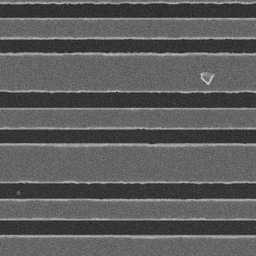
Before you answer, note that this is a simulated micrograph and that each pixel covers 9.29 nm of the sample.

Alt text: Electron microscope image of lines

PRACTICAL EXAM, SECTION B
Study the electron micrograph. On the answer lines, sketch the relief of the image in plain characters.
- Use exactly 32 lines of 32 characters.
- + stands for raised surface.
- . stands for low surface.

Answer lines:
................................
................................
++++++++++++++++++++++++++++++++
++++++++++++++++++++++++++++++++
++++++++++++++++++++++++++++++++
................................
................................
++++++++++++++++++++++++++++++++
++++++++++++++++++++++++++++++++
++++++++++++++++++++++++++++++++
++++++++++++++++++++++++++++++++
......+.++........++.++++++.++.+
................................
................................
++++++++++++++++++++++++++++++++
++++++++++++++++++++++++++++++++
................................
................................
++++++++++++++++++++++++++++++++
++++++++++++++++++++++++++++++++
++++++++++++++++++++++++++++++++
++++++++++++++++++++++++++++++++
++++++++++++++++++++++++++++++++
................................
................................
++++++++++++++++++++++++++++++++
++++++++++++++++++++++++++++++++
................................
................................
++++++++++++++++++++++++++++++++
++++++++++++++++++++++++++++++++
++++++++++++++++++++++++++++++++